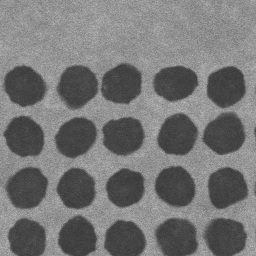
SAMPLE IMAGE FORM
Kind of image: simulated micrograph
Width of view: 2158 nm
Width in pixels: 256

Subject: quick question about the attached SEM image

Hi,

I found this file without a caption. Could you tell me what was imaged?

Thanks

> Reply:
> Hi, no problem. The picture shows a regular array of holes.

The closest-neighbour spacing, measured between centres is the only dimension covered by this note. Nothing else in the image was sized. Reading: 411 nm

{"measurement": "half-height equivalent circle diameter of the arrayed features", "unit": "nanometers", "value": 335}